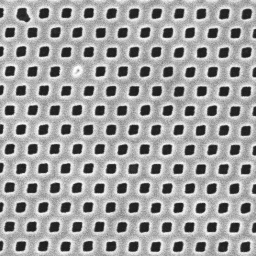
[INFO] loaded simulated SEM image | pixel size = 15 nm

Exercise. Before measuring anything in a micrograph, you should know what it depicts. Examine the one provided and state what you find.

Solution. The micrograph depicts a regular array of holes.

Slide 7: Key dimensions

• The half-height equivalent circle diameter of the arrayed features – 171 nm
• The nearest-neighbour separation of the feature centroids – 22 pixels